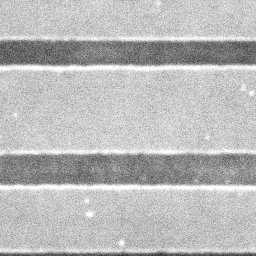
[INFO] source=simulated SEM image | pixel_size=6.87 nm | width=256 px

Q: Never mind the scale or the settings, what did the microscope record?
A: lines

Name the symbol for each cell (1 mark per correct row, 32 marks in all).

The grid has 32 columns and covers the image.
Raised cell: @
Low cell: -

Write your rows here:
@@@@@@@@@@@@@@@@@@@@@@@@@@@@@@@@
@@@@@@@@@@@@@@@@@@@@@@@@@@@@@@@@
@@@@@@@@@@@@@@@@@@@@@@@@@@@@@@@@
@@@@@@@@@@@@@@@@@@@@@@@@@@@@@@@@
@@@@@@@@@@@@@@@@@@@@@@@@@@@@@@@@
--------------------------------
--------------------------------
--------------------------------
@@@@@@@@@@@@@@@@@@@@@@@@@@@@@@@@
@@@@@@@@@@@@@@@@@@@@@@@@@@@@@@@@
@@@@@@@@@@@@@@@@@@@@@@@@@@@@@@@@
@@@@@@@@@@@@@@@@@@@@@@@@@@@@@@@@
@@@@@@@@@@@@@@@@@@@@@@@@@@@@@@@@
@@@@@@@@@@@@@@@@@@@@@@@@@@@@@@@@
@@@@@@@@@@@@@@@@@@@@@@@@@@@@@@@@
@@@@@@@@@@@@@@@@@@@@@@@@@@@@@@@@
@@@@@@@@@@@@@@@@@@@@@@@@@@@@@@@@
@@@@@@@@@@@@@@@@@@@@@@@@@@@@@@@@
@@@@@@@@@@@@@@@@@@@@@@@@@@@@@@@@
--------------------------------
--------------------------------
--------------------------------
--------------------------------
@@@@@@@@@@@@@@@@@@@@@@@@@@@@@@@@
@@@@@@@@@@@@@@@@@@@@@@@@@@@@@@@@
@@@@@@@@@@@@@@@@@@@@@@@@@@@@@@@@
@@@@@@@@@@@@@@@@@@@@@@@@@@@@@@@@
@@@@@@@@@@@@@@@@@@@@@@@@@@@@@@@@
@@@@@@@@@@@@@@@@@@@@@@@@@@@@@@@@
@@@@@@@@@@@@@@@@@@@@@@@@@@@@@@@@
@@@@@@@@@@@@@@@@@@@@@@@@@@@@@@@@
--------------------------------